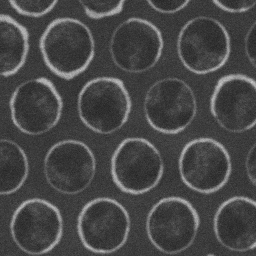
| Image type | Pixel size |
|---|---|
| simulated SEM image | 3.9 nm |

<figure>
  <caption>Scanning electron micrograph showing a regular array of raised bodies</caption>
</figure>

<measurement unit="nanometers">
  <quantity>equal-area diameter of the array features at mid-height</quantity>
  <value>208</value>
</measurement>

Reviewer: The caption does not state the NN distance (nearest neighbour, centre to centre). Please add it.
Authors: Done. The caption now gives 260 nm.